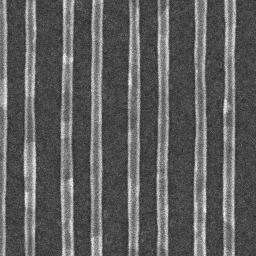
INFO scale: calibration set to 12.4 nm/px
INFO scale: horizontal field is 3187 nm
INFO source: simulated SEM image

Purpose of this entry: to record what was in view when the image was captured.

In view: parallel lines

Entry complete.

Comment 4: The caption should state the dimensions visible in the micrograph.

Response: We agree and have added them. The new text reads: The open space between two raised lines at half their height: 21.3 pixels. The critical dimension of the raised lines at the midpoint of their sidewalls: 109 nm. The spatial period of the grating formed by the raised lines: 0.414 µm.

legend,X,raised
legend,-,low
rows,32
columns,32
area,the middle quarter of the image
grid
XX-----XX--------XX-----XX------
XX-----XX--------XX-----XX------
XX-----XX--------XX-----XX------
XX-----XX--------XX-----XX------
XX-----XX-------XXX-----XX------
XX-----XX-------XXX-----XX------
XX-----XX-------XXX-----XX------
XX-----XX-------XXX-----XX------
XX-----XX-------XXX-----XX------
XX-----XX-------XXX-----XX------
XX-----XX-------XXX-----XX------
XX-----XX-------XXX-----XX------
XX-----XX-------XXX-----XX------
XX-----XX-------XXX-----XX------
XX-----XX-------XXX-----XX------
XX-----XX-------XXX-----XX------
XX-----XX-------XXX-----XX------
XX-----XX-------XXX-----XX------
XX-----XX-------XXX-----XX------
XX-----XX-------XXX-----XX------
XX-----XX-------XXX-----XX------
XX-----XX-------XXX-----XX------
XX-----XX-------XXX-----XX------
XX-----XX-------XXX-----XX------
XX-----XX-------XXX----XXX------
XX-----XX-------XXX----XX-------
XX-----XX-------XXX----XX-------
XX-----XX-------XXX----XX-------
XX-----XX-------XX-----XXX------
XX-----XX-------XX-----XXX------
XX-----XX-------XX-----XXX------
XX-----XX-------XX-----XXX------